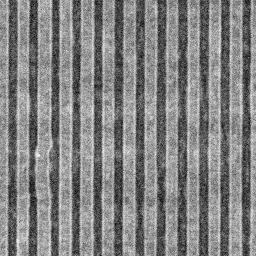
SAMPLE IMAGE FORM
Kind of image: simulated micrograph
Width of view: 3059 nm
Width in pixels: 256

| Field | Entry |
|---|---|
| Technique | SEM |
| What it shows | parallel lines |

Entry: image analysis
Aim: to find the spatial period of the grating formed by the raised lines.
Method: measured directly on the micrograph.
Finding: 254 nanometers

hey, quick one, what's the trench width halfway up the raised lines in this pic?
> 10.2 pixels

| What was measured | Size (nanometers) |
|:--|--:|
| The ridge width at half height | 133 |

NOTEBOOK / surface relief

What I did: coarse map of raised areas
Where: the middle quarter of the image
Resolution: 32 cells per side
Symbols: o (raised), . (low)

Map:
oo..ooo...oo...ooo...oo...oo...o
oo..ooo...oo...ooo...oo...oo...o
oo..ooo...oo...ooo...oo...oo...o
oo..ooo...oo...ooo..ooo...oo...o
oo..ooo...oo...ooo..ooo...oo...o
oo..ooo...oo...ooo..ooo...oo...o
oo..ooo...oo...ooo..ooo...oo...o
oo..ooo...oo...ooo..ooo...oo...o
oo..ooo...oo...ooo..ooo...oo...o
oo..ooo...oo...ooo..ooo...oo...o
oo..ooo...oo...ooo..ooo...oo...o
oo..ooo...oo...ooo..ooo...oo...o
oo..ooo...oo...ooo..ooo...oo...o
oo..ooo...oo...ooo..ooo...oo...o
oo..ooo...oo...ooo..ooo...oo...o
oo..ooo...oo...ooo..ooo...oo...o
oo..ooo...oo...ooo..ooo...oo...o
oo..ooo...oo...ooo..ooo...oo...o
oo..ooo...oo...ooo..ooo...oo...o
oo..ooo...oo...ooo..ooo...oo...o
oo..ooo...oo...ooo..ooo...oo...o
oo..ooo...oo...ooo..ooo...oo...o
oo..ooo...oo...ooo..ooo...oo...o
oo..ooo...oo...ooo..ooo...oo...o
oo..ooo...oo...ooo..ooo...oo...o
oo..ooo...oo...ooo..ooo...oo...o
oo..ooo...oo...ooo..ooo...oo...o
oo..ooo...oo...ooo..ooo...oo...o
oo..ooo...oo...ooo..ooo...oo...o
oo..ooo...oo...ooo..ooo...oo...o
oo..ooo...oo...ooo..ooo...oo...o
oo..ooo...oo...ooo..ooo...oo...o